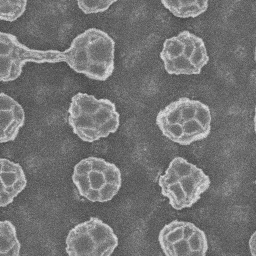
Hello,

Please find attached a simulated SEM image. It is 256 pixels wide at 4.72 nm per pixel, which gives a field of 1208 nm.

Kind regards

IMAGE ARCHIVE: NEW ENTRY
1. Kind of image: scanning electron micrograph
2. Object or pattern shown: raised bodies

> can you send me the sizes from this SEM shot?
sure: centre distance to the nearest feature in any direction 294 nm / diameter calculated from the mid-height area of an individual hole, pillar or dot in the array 213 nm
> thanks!